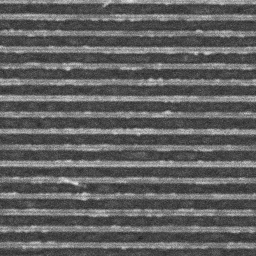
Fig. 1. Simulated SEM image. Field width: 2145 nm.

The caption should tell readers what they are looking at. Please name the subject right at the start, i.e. parallel lines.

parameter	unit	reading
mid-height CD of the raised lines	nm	37.7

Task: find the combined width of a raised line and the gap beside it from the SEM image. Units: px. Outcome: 16.3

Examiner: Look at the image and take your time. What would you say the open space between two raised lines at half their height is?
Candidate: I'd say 96.4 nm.